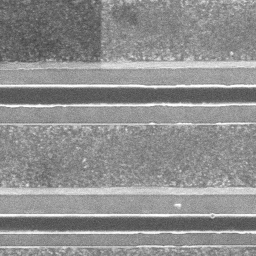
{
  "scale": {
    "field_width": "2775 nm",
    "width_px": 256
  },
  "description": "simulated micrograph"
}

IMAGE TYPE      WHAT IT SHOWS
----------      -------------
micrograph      lines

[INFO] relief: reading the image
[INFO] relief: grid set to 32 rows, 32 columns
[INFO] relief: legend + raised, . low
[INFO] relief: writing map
++++++++++++++++++++++++++++++++
++++++++++++++++++++++++++++++++
++++++++++++++++++++++++++++++++
++++++++++++++++++++++++++++++++
++++++++++++++++++++++++++++++++
++++++++++++++++++++++++++++++++
++++++++++++++++++++++++++++++++
++++++++++++++++++++++++++++++++
................................
................................
................................
++++++++++++++++++++++++++++++++
++++++++++++++++++++++++++++++++
................................
................................
..................+....+...+++++
++++++++++++++++++++++++++++++++
++++++++++++++++++++++++++++++++
++++++++++++++++++++++++++++++++
++++++++++++++++++++++++++++++++
++++++++++++++++++++++++++++++++
++++++++++++++++++++++++++++++++
++++++++++++++++++++++++++++++++
++++++++++++++++++++++++++++++++
................................
................................
................................
++++++++++++++++++++++++++++++++
++++++++++++++++++++++++++++++++
................................
................................
++++++++++++++++++++++++++++++++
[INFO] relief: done